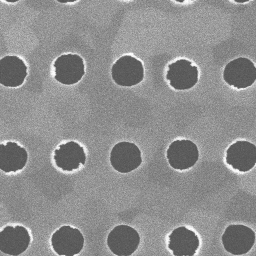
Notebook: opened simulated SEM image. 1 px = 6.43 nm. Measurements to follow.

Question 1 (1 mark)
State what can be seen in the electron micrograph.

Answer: holes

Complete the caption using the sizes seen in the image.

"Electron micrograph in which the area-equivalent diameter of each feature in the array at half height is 198 nanometers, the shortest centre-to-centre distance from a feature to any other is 358 nm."